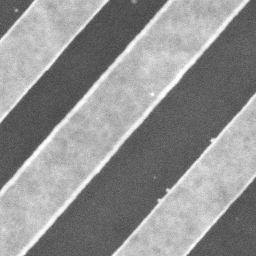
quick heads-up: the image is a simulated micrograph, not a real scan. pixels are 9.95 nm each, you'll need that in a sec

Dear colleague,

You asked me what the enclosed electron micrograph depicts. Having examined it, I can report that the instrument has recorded lines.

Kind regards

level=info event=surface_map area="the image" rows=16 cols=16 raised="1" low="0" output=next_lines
0011110000111110
0111100001111100
1111100011111000
1111000111111000
1110000111110000
1100001111100000
1000011111000001
0000111110000001
0001111100000011
0011111000000111
0111110000001111
1111100000011111
1111100000111110
1111000001111100
1110000011111000
1100000111110000